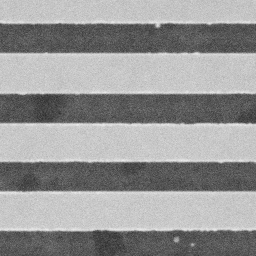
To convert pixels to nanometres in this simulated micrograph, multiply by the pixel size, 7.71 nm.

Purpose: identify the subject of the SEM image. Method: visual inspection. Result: lines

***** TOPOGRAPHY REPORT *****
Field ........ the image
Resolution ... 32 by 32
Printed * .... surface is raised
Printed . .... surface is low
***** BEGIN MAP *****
********************************
********************************
********************************
................................
................................
................................
................................
********************************
********************************
********************************
********************************
********************************
................................
................................
................................
................................
********************************
********************************
********************************
********************************
................................
................................
................................
................................
********************************
********************************
********************************
********************************
********************************
................................
................................
................................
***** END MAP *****